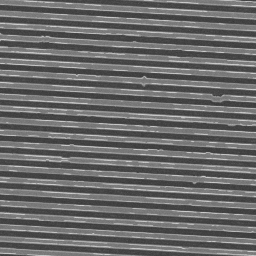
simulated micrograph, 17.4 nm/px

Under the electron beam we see parallel lines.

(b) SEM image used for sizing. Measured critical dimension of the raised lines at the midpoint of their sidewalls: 99.8 nm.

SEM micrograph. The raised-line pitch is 206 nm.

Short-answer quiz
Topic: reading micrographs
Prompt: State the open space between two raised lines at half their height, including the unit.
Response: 0.115 microns